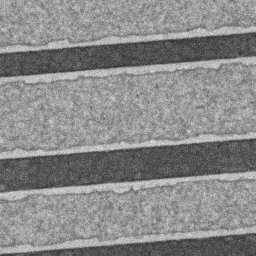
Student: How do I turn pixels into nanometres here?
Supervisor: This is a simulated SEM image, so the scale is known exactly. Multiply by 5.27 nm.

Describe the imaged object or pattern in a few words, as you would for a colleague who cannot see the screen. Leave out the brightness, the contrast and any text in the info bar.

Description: one or a few lines or trenches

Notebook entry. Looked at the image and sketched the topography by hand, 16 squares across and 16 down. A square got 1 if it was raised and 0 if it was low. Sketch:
1111111111111111
1111111111111111
1111111100000000
0000000000000000
0000001111111111
1111111111111111
1111111111111111
1111111111111111
1111111111111111
1111000000000000
0000000000000000
0000000011111111
1111111111111111
1111111111111111
1111111111111110
1110000000000000